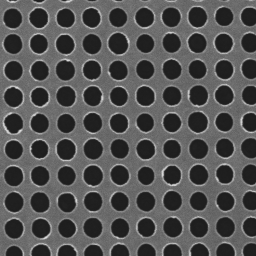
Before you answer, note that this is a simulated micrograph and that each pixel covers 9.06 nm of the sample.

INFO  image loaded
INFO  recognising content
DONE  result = a regular array of holes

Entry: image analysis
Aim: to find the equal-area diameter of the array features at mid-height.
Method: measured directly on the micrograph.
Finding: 168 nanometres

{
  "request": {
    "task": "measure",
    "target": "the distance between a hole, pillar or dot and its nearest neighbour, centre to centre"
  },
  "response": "235 nanometres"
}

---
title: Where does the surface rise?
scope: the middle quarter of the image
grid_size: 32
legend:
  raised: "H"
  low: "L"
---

LLHHHLLLLHHLLLLLHHLLLLHHHLLLLHHL
LLLHHLLLLHHLLLLLHHLLLLHHHLLLLHHL
LLLHHLLLLHHLLLLLHHLLLLHHHLLLLHHH
LLHHHHLLHHHHLLLHHHHLLLHHHHLLHHHH
HHHHHHHHHHHHHHHHHHHHHHHHHHHHHHHH
LHHHHHHHHHHHHHHHHHHHHHHHHHHHHHHH
LLHHHLLLLHHHLLLHHHLLLLHHHLLLLHHH
LLLHHLLLLHHHLLLLHHLLLLLHHLLLLHHL
LLLHHLLLLHHHLLLLHHLLLLLHHLLLLHHL
LLLHHLLLLHHHLLLLHHLLLLHHHLLLLHHH
LHHHHHHHHHHHHLHHHHHHLHHHHHHHHHHH
HHHHHHHHHHHHHHHHHHHHHHHHHHHHHHHH
LHHHHHLLHHHHHHHHHHHLLHHHHHLLHHHH
LLHHHLLLLHHHLLLLHHLLLLHHHLLLLHHL
LLLHHLLLLHHLLLLLHHLLLLLHHLLLLHHL
LLLHHLLLLHHHLLLLHHLLLLHHHLLLLHHL
LLHHHHLLLHHHLLLHHHHLLLHHHLLLHHHH
HHHHHHHHHHHHHHHHHHHHHHHHHHHHHHHH
HHHHHHHHHHHHHHHHHHHHHHHHHHHHHHHH
LLHHHHLLLHHHLLLHHHHLLLHHHHLLHHHH
LLLHHLLLLHHHLLLLHHLLLLLHHLLLLHHL
LLLHHLLLLLHHLLLLHHLLLLLHHLLLLHHL
LLLHHLLLLHHHLLLLHHLLLLLHHLLLLHHH
LLHHHHLLLHHHHLLHHHHHLHHHHHHHHHHH
HHHHHHHHHHHHHHHHHHHHHHHHHHHHHHHH
HHHHHHLLHHHHHLLHHHHHHHHHHHHHHHHH
LLHHHLLLLHHHLLLLHHHLLLHHHLLLLHHH
LLLHHLLLLLHHLLLLHHLLLLHHHLLLLHHL
LLLHHLLLLLHHLLLLHHHLLLHHHLLLLHHH
LLHHHLLLLHHHLLLLHHHLLLHHHHLLLHHH
HHHHHHHHHHHHHHHHHHHHHHHHHHHHHHHH
HHHHHHHHHHHHHHHHHHHHHHHHHHHHHHHH